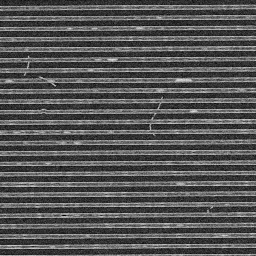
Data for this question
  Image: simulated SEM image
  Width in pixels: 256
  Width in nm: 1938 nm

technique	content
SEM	parallel lines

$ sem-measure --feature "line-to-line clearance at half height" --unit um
0.0464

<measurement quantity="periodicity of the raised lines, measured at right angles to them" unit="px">10.4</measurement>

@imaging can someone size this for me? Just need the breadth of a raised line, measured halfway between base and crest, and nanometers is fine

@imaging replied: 35